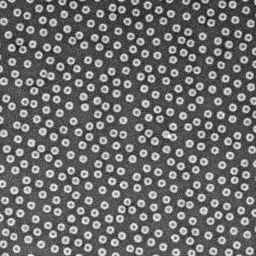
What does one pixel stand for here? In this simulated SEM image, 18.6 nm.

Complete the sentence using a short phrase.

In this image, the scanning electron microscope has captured a regular array of raised bodies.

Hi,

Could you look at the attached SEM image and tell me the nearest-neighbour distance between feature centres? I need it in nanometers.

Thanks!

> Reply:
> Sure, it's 209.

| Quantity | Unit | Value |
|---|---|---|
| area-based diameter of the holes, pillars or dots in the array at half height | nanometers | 111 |